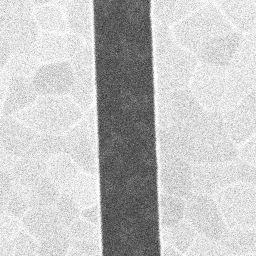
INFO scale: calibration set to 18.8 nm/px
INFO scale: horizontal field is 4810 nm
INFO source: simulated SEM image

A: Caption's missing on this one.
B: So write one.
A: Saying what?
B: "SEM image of one or a few lines or trenches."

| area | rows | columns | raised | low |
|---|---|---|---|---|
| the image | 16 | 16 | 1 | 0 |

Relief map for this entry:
1111110001111111
1111110000111111
1111110000111111
1111110000111111
1111110000111111
1111110000111111
1111110000111111
1111110000111111
1111110000111111
1111110000111111
1111110000111111
1111110000111111
1111110000111111
1111110000111111
1111110000111111
1111110000111111